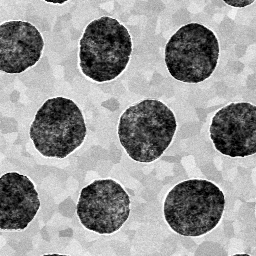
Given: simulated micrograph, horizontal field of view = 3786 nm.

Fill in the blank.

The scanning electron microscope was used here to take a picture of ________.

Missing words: holes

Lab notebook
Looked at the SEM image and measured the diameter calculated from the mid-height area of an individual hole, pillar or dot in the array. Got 868 nm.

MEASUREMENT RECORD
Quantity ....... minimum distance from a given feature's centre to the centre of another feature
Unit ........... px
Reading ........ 87.6